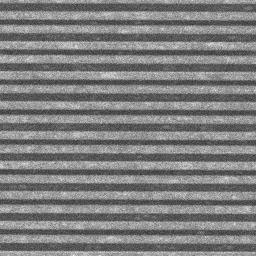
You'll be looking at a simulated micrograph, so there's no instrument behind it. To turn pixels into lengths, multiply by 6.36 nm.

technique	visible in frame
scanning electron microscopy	parallel lines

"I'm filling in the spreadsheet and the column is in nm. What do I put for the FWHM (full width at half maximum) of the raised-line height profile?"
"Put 49.3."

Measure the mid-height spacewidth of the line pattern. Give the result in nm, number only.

54.1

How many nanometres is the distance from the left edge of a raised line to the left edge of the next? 94.7